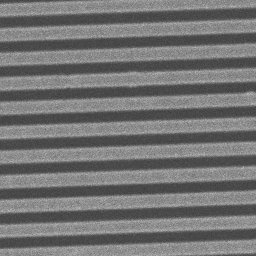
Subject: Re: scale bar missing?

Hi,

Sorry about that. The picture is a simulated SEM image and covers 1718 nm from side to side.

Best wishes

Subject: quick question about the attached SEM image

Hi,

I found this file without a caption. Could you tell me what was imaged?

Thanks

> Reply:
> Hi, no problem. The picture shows parallel lines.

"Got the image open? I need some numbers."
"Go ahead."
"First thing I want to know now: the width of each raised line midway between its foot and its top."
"0.093 um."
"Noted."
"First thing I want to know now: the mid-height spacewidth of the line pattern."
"67.9 nm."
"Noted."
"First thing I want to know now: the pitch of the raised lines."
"165 nm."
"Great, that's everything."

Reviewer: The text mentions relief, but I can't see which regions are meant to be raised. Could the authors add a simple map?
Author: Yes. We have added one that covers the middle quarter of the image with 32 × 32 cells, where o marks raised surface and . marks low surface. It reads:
................................
................................
........oooooooooooooooooooooooo
oooooooooooooooooooooooooooooooo
oooooooooooooooooooooooooooooooo
ooooooooooooooo.ooo.............
................................
................................
.........ooooooooooooooooooooooo
oooooooooooooooooooooooooooooooo
oooooooooooooooooooooooooooooooo
oooooooooooooooooooooo..........
................................
................................
...............ooooooooooooooooo
oooooooooooooooooooooooooooooooo
oooooooooooooooooooooooooooooooo
oooooooooooooooooooooo..........
................................
................................
................oooooooooooooooo
oooooooooooooooooooooooooooooooo
oooooooooooooooooooooooooooooooo
oooooooooooooooooooooooo...oo...
o...............................
................................
......................oooooooooo
oooooooooooooooooooooooooooooooo
oooooooooooooooooooooooooooooooo
ooooooooooooooooooooooooooooo...
oo..............................
................................